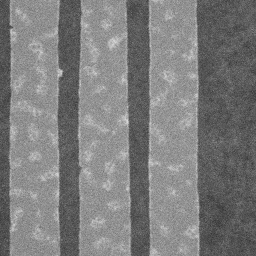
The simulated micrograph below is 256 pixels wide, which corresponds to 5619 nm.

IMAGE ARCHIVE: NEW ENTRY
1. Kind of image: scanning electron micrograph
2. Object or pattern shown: one or a few lines or trenches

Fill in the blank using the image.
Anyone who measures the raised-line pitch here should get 1.53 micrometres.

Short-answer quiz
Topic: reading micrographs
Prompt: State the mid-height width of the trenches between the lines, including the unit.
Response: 475 nm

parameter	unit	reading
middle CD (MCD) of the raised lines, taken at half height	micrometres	1.04